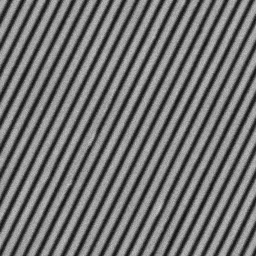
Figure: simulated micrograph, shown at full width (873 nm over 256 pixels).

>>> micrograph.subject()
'parallel lines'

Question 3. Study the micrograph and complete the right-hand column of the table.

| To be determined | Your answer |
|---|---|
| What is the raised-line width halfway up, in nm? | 23.3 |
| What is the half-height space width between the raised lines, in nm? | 16.4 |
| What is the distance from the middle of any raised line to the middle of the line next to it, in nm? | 39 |